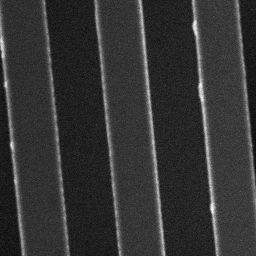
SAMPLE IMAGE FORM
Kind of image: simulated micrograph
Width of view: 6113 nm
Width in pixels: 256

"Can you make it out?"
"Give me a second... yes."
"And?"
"lines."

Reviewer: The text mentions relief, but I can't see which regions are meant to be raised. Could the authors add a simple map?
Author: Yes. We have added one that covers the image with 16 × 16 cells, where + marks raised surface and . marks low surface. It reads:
+++...+++...+++.
+++...+++...+++.
+++...+++...+++.
+++...+++...+++.
+++...+++...+++.
+++...+++...+++.
+++....++....++.
.+++...++....+++
.+++...+++...+++
.+++...+++...+++
.+++...+++...+++
.+++...+++...+++
.+++...+++...+++
.+++...+++...+++
.+++...+++...+++
.+++...+++....++